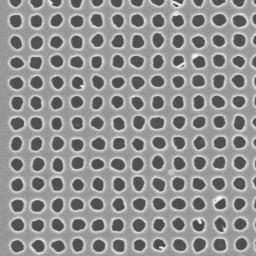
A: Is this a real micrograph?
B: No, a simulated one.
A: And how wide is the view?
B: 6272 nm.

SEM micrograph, a regular array of holes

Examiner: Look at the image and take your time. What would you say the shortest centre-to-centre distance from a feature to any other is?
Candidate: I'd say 0.481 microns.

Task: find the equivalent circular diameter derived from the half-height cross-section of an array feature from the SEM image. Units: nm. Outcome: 313